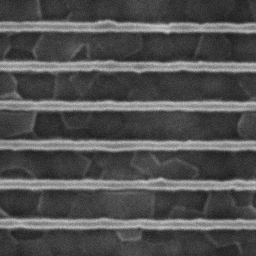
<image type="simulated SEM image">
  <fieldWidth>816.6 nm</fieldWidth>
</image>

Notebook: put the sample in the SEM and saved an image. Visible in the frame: parallel lines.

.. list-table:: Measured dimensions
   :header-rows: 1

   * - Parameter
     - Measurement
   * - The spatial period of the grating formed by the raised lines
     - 126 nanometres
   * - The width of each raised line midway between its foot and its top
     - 24.7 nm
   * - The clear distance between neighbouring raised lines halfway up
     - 31.7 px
